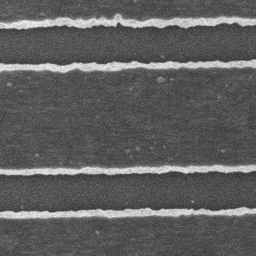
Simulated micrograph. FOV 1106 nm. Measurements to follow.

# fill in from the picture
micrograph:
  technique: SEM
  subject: one or a few lines or trenches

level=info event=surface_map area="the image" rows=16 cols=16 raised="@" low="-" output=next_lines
@@@@@@@@@@@@@@@@
@@@-----@-------
----------------
----------------
@@@@@@@@@@@@@@@@
@@@@@@@@@@@@@@@@
@@@@@@@@@@@@@@@@
@@@@@@@@@@@@@@@@
@@@@@@@@@@@@@@@@
@@@@@@@@@@@@@@@@
@@@@@@@@@@@@@@@@
----------------
----------------
@@@@@@@@@@@@@@@@
@@@@@@@@@@@@@@@@
@@@@@@@@@@@@@@@@